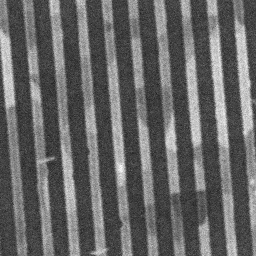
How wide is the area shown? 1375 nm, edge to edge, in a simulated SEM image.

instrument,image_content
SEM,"parallel lines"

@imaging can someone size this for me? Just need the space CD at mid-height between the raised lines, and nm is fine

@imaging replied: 99.7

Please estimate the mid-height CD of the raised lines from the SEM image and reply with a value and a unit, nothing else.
0.0401 um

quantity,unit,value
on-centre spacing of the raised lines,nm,140